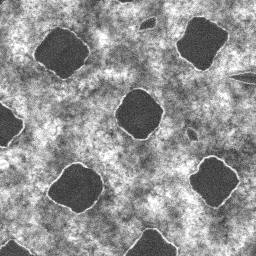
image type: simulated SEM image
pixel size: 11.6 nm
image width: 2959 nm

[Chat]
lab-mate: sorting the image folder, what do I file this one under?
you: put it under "raised bodies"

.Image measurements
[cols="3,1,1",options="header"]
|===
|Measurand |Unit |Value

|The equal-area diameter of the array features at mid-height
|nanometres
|567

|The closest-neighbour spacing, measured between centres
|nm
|1120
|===